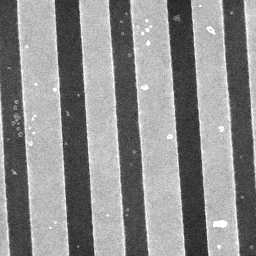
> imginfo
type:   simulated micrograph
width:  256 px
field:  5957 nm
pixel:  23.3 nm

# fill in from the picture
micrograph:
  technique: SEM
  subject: lines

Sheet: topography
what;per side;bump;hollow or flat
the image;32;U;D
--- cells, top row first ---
DDUUUUUDDDUUUDDDUUUUUDDDUUUUDDDU
DDUUUUUDDDUUUUDDDUUUUDDDUUUUDDDU
DDUUUUUDDDUUUUDDDUUUUDDDUUUUDDDU
DDUUUUUDDDUUUUDDDUUUUDDDUUUUDDDU
DDDUUUUDDDUUUUDDDUUUUDDDUUUUDDDU
DDDUUUUDDDUUUUDDDUUUUDDDUUUUDDDU
DDDUUUUDDDUUUUDDDUUUUDDDUUUUDDDU
DDDUUUUDDDUUUUDDDUUUUDDDUUUUDDDU
DDDUUUUDDDUUUUDDDUUUUDDDDUUUDDDU
DDDUUUUDDDDUUUDDDUUUUDDDDUUUDDDU
DDDUUUUDDDDUUUDDDUUUUUDDDUUUDDDU
DDDUUUUDDDDUUUDDDUUUUUDDDUUUDDDU
DDDUUUUDDDDUUUDDDUUUUUDDDUUUDDDU
DDDUUUUUDDDUUUDDDUUUUUDDDUUUUDDU
DDDUUUUUDDDUUUDDDUUUUUDDDUUUUDDD
DDDUUUUUDDDUUUUDDDUUUUDDDUUUUDDD
DDDUUUUUDDDUUUUDDDUUUUDDDUUUUDDD
DDDUUUUUDDDUUUUDDDUUUUDDDUUUUDDD
DDDUUUUUDDDUUUUDDDUUUUDDDUUUUDDD
DDDUUUUUDDDUUUUDDDUUUUDDDUUUUDDD
DDDDUUUUDDDUUUUDDDUUUUDDDUUUUDDD
DDDDUUUUDDDUUUUDDDUUUUDDDUUUUDDD
UDDDUUUUDDDUUUUDDDUUUUDDDDUUUDDD
UDDDUUUUDDDUUUUDDDUUUUDDDDUUUDDD
UDDDUUUUDDDUUUUDDDUUUUDDDDUUUDDD
UDDDUUUUDDDDUUUDDDUUUUUDDDUUUDDD
UDDDUUUUDDDDUUUDDDUUUUUDDDUUUDDD
UDDDUUUUDDDDUUUDDDUUUUUDDDUUUUDD
UDDDUUUUDDDDUUUDDDUUUUUDDDUUUUDD
UDDDUUUUDDDDUUUDDDUUUUUDDDUUUUDD
UDDDUUUUDDDDUUUUDDDUUUUDDDUUUUDD
UDDDUUUUDDDDUUUUDDDUUUUDDDUUUUDD